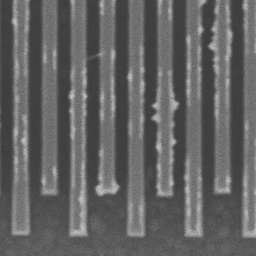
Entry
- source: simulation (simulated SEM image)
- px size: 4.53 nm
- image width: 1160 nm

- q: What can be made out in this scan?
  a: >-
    parallel lines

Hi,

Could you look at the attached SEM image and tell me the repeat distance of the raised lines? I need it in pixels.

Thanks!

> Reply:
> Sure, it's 28.8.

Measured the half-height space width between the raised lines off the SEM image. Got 62.3 nanometers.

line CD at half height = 70.7 nm